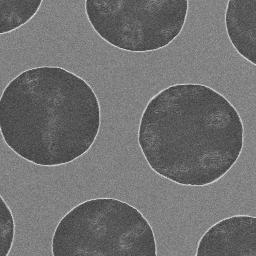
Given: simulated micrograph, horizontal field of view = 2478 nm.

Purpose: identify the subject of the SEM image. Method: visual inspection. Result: holes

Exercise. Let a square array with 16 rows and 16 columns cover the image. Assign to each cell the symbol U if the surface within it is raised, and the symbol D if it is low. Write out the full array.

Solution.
DDUUUDDDDDDDUUDD
DUUUUUDDDDDUUUDD
UUUUUUUDDDDUUUDD
UUUUUUUUUUUUUUUD
UUDDUUUUUUUUUUUU
DDDDDDUUUUUDDUUU
DDDDDDUUUDDDDDUU
DDDDDDUUUDDDDDDU
DDDDDDUUUDDDDDDU
UDDDDUUUUDDDDDDU
UUUUUUUUUUDDDDUU
UUUUUUUUUUUUDUUU
UUUUUUDUUUUUUUUU
DUUUDDDDDUUUUUUU
DUUDDDDDDUUUUDDD
DUUDDDDDDDUUDDDD